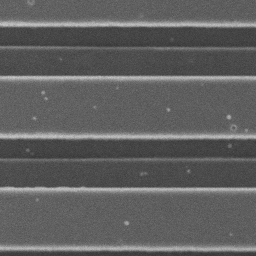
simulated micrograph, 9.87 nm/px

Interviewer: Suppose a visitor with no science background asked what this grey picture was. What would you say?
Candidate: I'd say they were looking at lines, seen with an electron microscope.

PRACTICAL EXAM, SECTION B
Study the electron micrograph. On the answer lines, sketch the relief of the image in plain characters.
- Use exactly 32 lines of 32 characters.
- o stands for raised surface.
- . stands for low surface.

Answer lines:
oooooooooooooooooooooooooooooooo
oooooooooooooooooooooooooooooooo
oooooooooooooooooooooooooooooooo
................................
................................
................................
................................
................................
................................
................................
oooooooooooooooooooooooooooooooo
oooooooooooooooooooooooooooooooo
oooooooooooooooooooooooooooooooo
oooooooooooooooooooooooooooooooo
oooooooooooooooooooooooooooooooo
oooooooooooooooooooooooooooooooo
oooooooooooooooooooooooooooooooo
................................
................................
................................
................................
................................
................................
.o...o..........................
oooooooooooooooooooooooooooooooo
oooooooooooooooooooooooooooooooo
oooooooooooooooooooooooooooooooo
oooooooooooooooooooooooooooooooo
oooooooooooooooooooooooooooooooo
oooooooooooooooooooooooooooooooo
oooooooooooooooooooooooooooooooo
................................